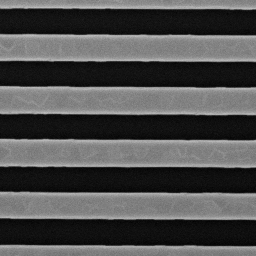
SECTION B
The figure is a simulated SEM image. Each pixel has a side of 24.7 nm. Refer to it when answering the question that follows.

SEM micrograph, wiring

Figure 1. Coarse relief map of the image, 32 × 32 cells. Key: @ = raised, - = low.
@@@@@@@@@@@@@@@@@@@@@@@@@@@@@@@@
--------------------------------
--------------------------------
--------------------------------
@@@@@@@@@@@@@@@@@@@@@@@@@@@@@@@@
@@@@@@@@@@@@@@@@@@@@@@@@@@@@@@@@
@@@@@@@@@@@@@@@@@@@@@@@@@@@@@@@@
@@@@@@@@@@@@@@@@@@@@@@@@@@@@@@@@
--------------------------------
--------------------------------
--------------------------------
@@@@@@@@@@@@@@@@@@@@@@@@@@@@@@@@
@@@@@@@@@@@@@@@@@@@@@@@@@@@@@@@@
@@@@@@@@@@@@@@@@@@@@@@@@@@@@@@@@
--------------------------------
--------------------------------
--------------------------------
@@---@--------------------------
@@@@@@@@@@@@@@@@@@@@@@@@@@@@@@@@
@@@@@@@@@@@@@@@@@@@@@@@@@@@@@@@@
@@@@@@@@@@@@@@@@@@@@@@@@@@@@@@@@
--------------------------------
--------------------------------
--------------------------------
@@@@@@@@@@@@@@@@@@@@@@@@@@@@@@@@
@@@@@@@@@@@@@@@@@@@@@@@@@@@@@@@@
@@@@@@@@@@@@@@@@@@@@@@@@@@@@@@@@
--------------------------------
--------------------------------
--------------------------------
--------------------------------
@@@@@@@@@@@@@@@@@@@@@@@@@@@@@@@@